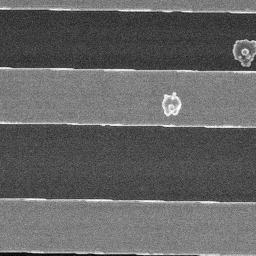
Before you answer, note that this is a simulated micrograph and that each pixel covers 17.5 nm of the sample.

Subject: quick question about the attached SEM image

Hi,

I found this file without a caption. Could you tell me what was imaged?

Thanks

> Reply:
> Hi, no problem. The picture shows lines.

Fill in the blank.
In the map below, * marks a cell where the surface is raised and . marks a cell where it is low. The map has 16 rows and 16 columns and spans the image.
****************
................
................
................
****************
****************
****************
****************
................
................
................
................
***.............
****************
****************
****************